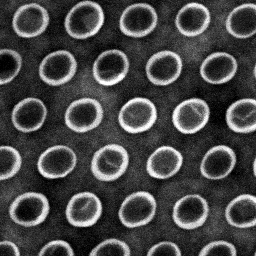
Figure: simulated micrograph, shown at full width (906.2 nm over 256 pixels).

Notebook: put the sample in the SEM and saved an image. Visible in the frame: a regular array of raised bodies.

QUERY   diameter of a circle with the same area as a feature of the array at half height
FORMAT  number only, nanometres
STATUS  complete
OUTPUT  115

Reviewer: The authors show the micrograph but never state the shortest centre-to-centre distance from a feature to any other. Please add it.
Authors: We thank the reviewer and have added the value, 53.6 px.